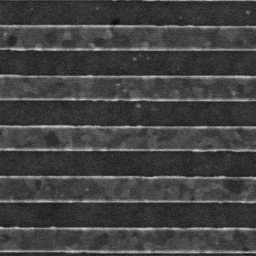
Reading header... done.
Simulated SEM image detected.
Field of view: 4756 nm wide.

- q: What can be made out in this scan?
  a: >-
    lines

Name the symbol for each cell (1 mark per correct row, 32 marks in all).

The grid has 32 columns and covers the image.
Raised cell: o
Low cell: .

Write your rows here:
................................
................................
................................
oooooooooooooooooooooooooooooooo
oooooooooooooooooooooooooooooooo
oooooooooooooooooooooooooooooooo
................................
................................
................................
oo..............................
oooooooooooooooooooooooooooooooo
oooooooooooooooooooooooooooooooo
................o.oooooooooooooo
................................
................................
................................
oooooooooooooooooooooooooooooooo
oooooooooooooooooooooooooooooooo
oooooooooooooooooooooooooooooooo
................................
................................
................................
oooooooooooooooooooooooooooooooo
oooooooooooooooooooooooooooooooo
oooooooooooooooooooooooooooooooo
................................
................................
................................
................................
oooooooooooooooooooooooooooooooo
oooooooooooooooooooooooooooooooo
............oooooooooooooooooooo